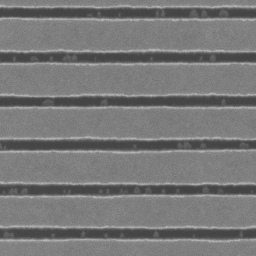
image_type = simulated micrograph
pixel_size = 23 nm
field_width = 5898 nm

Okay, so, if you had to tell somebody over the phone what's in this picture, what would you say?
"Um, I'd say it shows lines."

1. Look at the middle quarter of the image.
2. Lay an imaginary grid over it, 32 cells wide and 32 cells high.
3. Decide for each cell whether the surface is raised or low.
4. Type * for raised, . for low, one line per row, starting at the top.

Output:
********************************
********************************
********************************
********************************
********************************
********************************
********************************
********************************
................................
................................
...........****....*.*****......
********************************
********************************
********************************
********************************
********************************
********************************
********************************
********************************
................................
................................
.***..****.........*....********
********************************
********************************
********************************
********************************
********************************
********************************
********************************
********************************
................................
................................